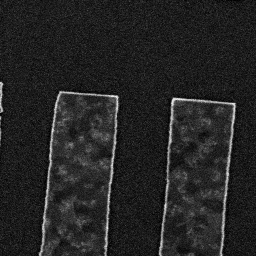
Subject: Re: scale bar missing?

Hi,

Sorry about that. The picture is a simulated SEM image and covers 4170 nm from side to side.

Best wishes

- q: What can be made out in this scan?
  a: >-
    one or a few lines or trenches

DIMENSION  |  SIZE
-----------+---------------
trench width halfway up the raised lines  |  0.889 micrometres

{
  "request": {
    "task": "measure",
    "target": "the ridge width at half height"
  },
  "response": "1.02 microns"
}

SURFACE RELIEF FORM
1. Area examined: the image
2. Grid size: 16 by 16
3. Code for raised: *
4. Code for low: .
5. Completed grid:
................
................
................
................
................
................
....***....***..
...****....****.
...****....***..
...****....***..
...****...****..
...****...****..
...****...****..
...****...****..
...****...****..
...****...****..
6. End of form